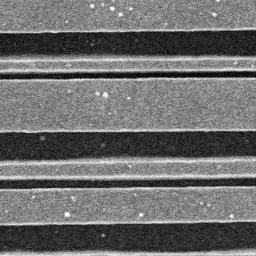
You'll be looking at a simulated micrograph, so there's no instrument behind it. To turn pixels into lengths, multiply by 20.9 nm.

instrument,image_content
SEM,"lines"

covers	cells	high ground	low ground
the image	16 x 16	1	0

1111111111111111
1111111111111111
0000000000000000
0000000000000000
1111111111111111
1111111111111111
1111111111111111
1111111111111111
0000000000000000
0000000000000000
1111111111111111
1111111111111111
1111111111111111
1111111111111111
0000000000000000
0000000000000000